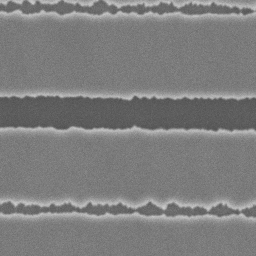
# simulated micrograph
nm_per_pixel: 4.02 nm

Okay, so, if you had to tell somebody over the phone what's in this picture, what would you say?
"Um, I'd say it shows lines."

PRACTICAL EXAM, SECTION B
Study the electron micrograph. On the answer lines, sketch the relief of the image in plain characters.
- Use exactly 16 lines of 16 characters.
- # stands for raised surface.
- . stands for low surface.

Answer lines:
################
################
################
################
################
################
................
................
################
################
################
################
################
################
################
################